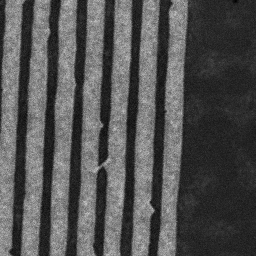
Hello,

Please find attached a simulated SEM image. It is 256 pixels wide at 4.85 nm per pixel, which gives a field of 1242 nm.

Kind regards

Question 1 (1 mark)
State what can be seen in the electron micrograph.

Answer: parallel lines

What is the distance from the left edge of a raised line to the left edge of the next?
0.133 µm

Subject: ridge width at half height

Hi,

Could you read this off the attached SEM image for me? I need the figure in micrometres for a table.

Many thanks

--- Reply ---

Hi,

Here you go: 0.0799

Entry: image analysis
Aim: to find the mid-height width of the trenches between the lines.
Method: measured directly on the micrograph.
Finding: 11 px